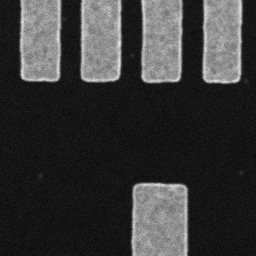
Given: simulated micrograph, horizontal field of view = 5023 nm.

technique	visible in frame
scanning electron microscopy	wiring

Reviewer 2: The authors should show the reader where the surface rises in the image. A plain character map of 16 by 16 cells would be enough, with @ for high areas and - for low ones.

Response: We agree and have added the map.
-@@@-@@--@@--@@-
-@@@-@@--@@--@@-
-@@@-@@--@@--@@-
-@@@-@@--@@--@@-
-@@@-@@--@@--@@-
----------------
----------------
----------------
----------------
----------------
----------------
----------------
--------@@@@----
--------@@@@----
--------@@@@----
--------@@@@----